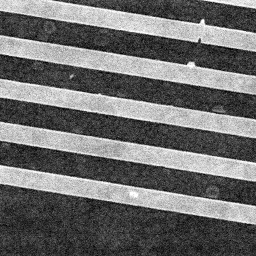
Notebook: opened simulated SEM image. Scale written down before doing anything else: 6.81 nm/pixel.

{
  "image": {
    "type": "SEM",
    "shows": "parallel lines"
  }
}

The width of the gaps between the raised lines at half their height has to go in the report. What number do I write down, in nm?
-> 169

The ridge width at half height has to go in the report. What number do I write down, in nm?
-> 122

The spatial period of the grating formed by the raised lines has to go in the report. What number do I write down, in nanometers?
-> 291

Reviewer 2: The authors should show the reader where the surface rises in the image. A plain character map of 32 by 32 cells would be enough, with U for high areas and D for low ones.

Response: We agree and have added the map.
UUUUUUUUUDDDDDDDDDDDDDDDDDDDDUUU
DUUUUUUUUUUUUUUDDDDDDDDDDDDDDDDD
DDDDDDDUUUUUUUUUUUUUUUDDDDDDDDDD
DDDDDDUDDDDDDDUUUUUUUUUUUUUUDDDD
DDDDDUDDDDDDDDDDDDDDUUUUUUUUUUUU
UUUUUUDDDDDDDDDDDDDDDDDDDDUUUUUU
UUUUUUUUUUUUUDDDDDDDDDDDDDDDDDDD
DDDDUUUUUUUUUUUUUUUDDDDDDDDDDDDD
DDDDDDDDDDDUUUUUUUUUUUUUUDDDDDDD
DDDDDDDDDDDDDDDDDUUUUUUUUUUUUUUD
UUUUDDDDDDDDDDDDDDDDDDDDUUUUUUUU
UUUUUUUUUUDDDDDDDDDDDDDDDDDDDDUU
DDUUUUUUUUUUUUUUDDDDDDDDDDDDDDDD
DDDDDDDDUUUUUUUUUUUUUUUDDDDUDDDD
DDDDDDDDDDDDDDDUUUUUUUUUUUUUUDDD
UDDDDDDDDDDDDDDDDDDDDUUUUUUUUUUU
UUUUUUUDDDDDDDDDDDDDDDDDDDDUUUUU
UUUUUUUUUUUUUUDDDDDDDDDDDDDDDDDD
DDDDDDUUUUUUUUUUUUUUDDDDDDDDDDDD
DDDDDDDDDDDDUUUUUUUUUUUUUUDDDDDD
DDDDDDDDDDDDDDDDDDUUUUUUUUUUUUUU
UUUUUDDDDDDDDDDDDDDDDDDDDUUUUUUU
UUUUUUUUUUUDDDDDDDDDDDDDDDDDDDDU
DDDDUUUUUUUUUUUUUDDDDDDDDDUDDDDD
DDDDDDDDDDUUUUUUUUUUUUUUDDUDDDDD
DDDDDDDDDDDDDDDDUUUUUUUUUUUUUUDD
DDDDDDDDDDDDDDDDDDDDDDDUUUUUUUUU
DDDDDDDDDDDDDDDDDDDDDDDDDDDDDUUU
DDDDDDDDDDDDDDDDDDDDDDDDDDDDDDDD
DDDDDDDDDDDDDDDDDDDDDDDDDDDDDDDD
DDDDDDDDDDDDDDDDDDDDDDDDDDDDDDDD
DDDDDDDDDDDDDDDDDDDDDDDDDDDDDDDD